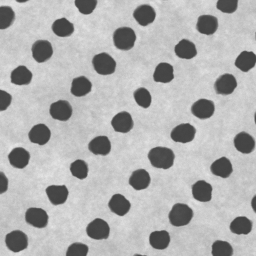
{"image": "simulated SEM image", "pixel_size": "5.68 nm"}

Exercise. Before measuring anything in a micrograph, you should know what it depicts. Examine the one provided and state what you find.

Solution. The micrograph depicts a regular array of holes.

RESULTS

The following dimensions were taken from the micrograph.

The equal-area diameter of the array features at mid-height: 117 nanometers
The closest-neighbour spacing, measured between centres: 0.179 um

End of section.